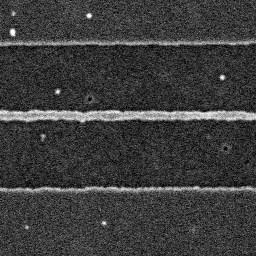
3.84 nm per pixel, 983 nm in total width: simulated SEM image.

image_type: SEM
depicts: lines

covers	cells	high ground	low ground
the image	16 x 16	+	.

++++++++++++++++
++++++++++++++++
++++++++++++++++
................
................
................
................
.+..............
................
................
................
................
++++++++++++++++
++++++++++++++++
++++++++++++++++
++++++++++++++++